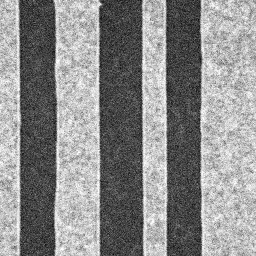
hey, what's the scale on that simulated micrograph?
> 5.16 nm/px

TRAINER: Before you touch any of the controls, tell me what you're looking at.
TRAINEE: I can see one or a few lines or trenches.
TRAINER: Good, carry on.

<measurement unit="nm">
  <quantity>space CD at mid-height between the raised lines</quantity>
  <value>198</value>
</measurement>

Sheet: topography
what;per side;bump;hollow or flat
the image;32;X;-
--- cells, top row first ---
XX-----XXXXX------XX-----XXXXXXX
XX-----XXXXX------XXX----XXXXXXX
XX-----XXXXX------XX-----XXXXXXX
XX-----XXXXX------XX-----XXXXXXX
XX-----XXXXX------XX-----XXXXXXX
XX-----XXXXX------XX-----XXXXXXX
XX-----XXXXX------XX-----XXXXXXX
XX-----XXXXX------XX------XXXXXX
XX-----XXXXX------XXX-----XXXXXX
XX-----XXXXX------XXX----XXXXXXX
XX-----XXXXX------XXX----XXXXXXX
XX-----XXXXX------XXX----XXXXXXX
XX-----XXXXX------XXX----XXXXXXX
XX-----XXXXX------XXX----XXXXXXX
XX-----XXXXX------XXX----XXXXXXX
XX-----XXXXX------XXX----XXXXXXX
XX-----XXXXX------XXX----XXXXXXX
XX-----XXXXX------XXX----XXXXXXX
XX-----XXXXX------XXX----XXXXXXX
XX-----XXXXX------XXX----XXXXXXX
XX-----XXXXX------XXX----XXXXXXX
XX-----XXXXX------XXX----XXXXXXX
XX-----XXXXX------XXX----XXXXXXX
XX-----XXXXX------XXX----XXXXXXX
XX-----XXXXX------XXX----XXXXXXX
XX-----XXXXX------XXX----XXXXXXX
XX-----XXXXX------XXX----XXXXXXX
XX-----XXXXX------XXX----XXXXXXX
XX-----XXXXX------XXX----XXXXXXX
XX-----XXXXX------XXX-----XXXXXX
XX-----XXXXX------XXX-----XXXXXX
XX-----XXXXX------XXX-----XXXXXX